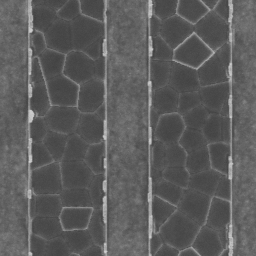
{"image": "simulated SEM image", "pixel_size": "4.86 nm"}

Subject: one or a few lines or trenches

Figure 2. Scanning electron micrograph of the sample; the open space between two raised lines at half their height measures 205 nm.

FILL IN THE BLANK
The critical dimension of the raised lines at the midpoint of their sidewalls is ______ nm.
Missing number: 379